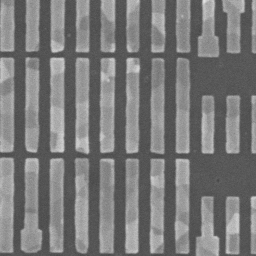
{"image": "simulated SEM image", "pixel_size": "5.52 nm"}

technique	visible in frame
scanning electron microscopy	wiring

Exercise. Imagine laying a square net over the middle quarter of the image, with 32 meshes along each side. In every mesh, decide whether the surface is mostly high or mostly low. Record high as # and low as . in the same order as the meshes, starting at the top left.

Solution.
...###...####...###...###...###.
...###...####...###...###...###.
...###...####...###...###...###.
...###...####...###...###...###.
...###...###....###...###...###.
...###...###....###...###...###.
...###...###....###...###...###.
...###...###....###...###...###.
...###...###....###...###...###.
...###...###....###...###...###.
...###...###....###...###...###.
...###...###....##....###...###.
...###...###....##....###...###.
...###...###....##....###...###.
...###...###....##....###...###.
...###...###....##....###...###.
...###...###....###...###...###.
...###...###....###...###...###.
...###...###....###...###...###.
...###...###....##....###...###.
...###...###....##....###...###.
...###...###....##....###...###.
................................
................................
...###...###....##....###...###.
...###...###....##....###...###.
...###...###....##....###...###.
...###...###....##....###...###.
...###...###....##....###...###.
...###...###....##....###...###.
...###...###....##....###...###.
...###...###....##....###...###.